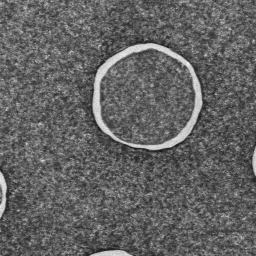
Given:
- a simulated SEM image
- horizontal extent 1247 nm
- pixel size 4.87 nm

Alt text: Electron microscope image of raised bodies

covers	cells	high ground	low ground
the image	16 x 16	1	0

0000000000000000
0000000000000000
0000000000000000
0000000111100000
0000001111110000
0000001111110000
0000001111110000
0000001111110000
0000000111100000
0000000000000000
0000000000000000
0000000000000000
0000000000000000
0000000000000000
0000000000000000
0000000000000000